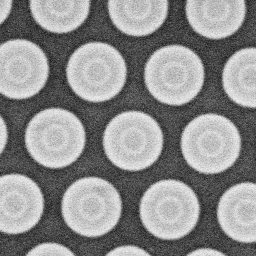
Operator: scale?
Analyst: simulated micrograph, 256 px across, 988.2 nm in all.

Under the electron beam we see an array of small figures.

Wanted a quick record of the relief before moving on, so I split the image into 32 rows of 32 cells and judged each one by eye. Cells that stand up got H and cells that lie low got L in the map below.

HLLLHHHHHHHLLLHHHHHHHLLHHHHHHHHL
HLLLHHHHHHHLLLHHHHHHHLLHHHHHHHHL
LLLLHHHHHHHLLLHHHHHHHLLLHHHHHHLL
LLLLLHHHHLLLLLLHHHHHLLLLHHHHHHLL
LLLLLLLLLLLLLLLLLLLLLLLLLHHHLLLL
HHHHLLLLLLLHHLLLLLLLLLLLLLLLLLLL
HHHHHLLLLHHHHHHLLLLHHHHHLLLLLLHH
HHHHHHLLLHHHHHHLLLLHHHHHHLLLLHHH
HHHHHHLLHHHHHHHHLLHHHHHHHLLLHHHH
HHHHHHLLHHHHHHHHLLHHHHHHHLLLHHHH
HHHHHHLLLHHHHHHLLLHHHHHHHLLLHHHH
HHHHHLLLLHHHHHHLLLLHHHHHHLLLHHHH
LLLLLLLLLLLHHLLLLLLLHHHHLLLLLHHH
LLLLLLLLLLLLLLLLLLLLLLLLLLLLLLLL
LLLLHHHHHLLLLLLHHHHLLLLLLHHHLLLL
HLLLHHHHHHLLLLHHHHHHLLLLHHHHHLLL
HLLHHHHHHHLLLHHHHHHHLLLHHHHHHHLL
HLLHHHHHHHHLLHHHHHHHLLLHHHHHHHLL
LLLHHHHHHHLLLHHHHHHHLLLHHHHHHHLL
LLLLHHHHHHLLLHHHHHHHLLLHHHHHHHLL
LLLLLHHHHLLLLLHHHHHLLLLLHHHHHLLL
LLLLLLLLLLLLLLLLLLLLLLLLLHHLLLLL
HHHHLLLLLLHHHLLLLLLLLLLLLLLLLLLL
HHHHHLLLLHHHHHLLLLLHHHHHLLLLLHHH
HHHHHLLLHHHHHHHLLLHHHHHHLLLLHHHH
HHHHHLLLHHHHHHHLLLHHHHHHHLLHHHHH
HHHHHLLLHHHHHHHLLLHHHHHHHLLHHHHH
HHHHHLLLHHHHHHHLLLHHHHHHHLLHHHHH
HHHHLLLLLHHHHHLLLLHHHHHHLLLLHHHH
LLLLLLLLLLLHLLLLLLLLHHHLLLLLLHHH
LLLLLHHLLLLLLLLLLLLLLLLLLLLLLLLL
LLLLHHHHHLLLLLHHHHLLLLLLHHHLLLLL